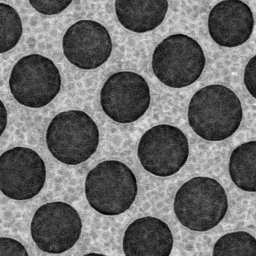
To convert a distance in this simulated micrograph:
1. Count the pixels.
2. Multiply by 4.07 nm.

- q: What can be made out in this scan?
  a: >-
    a regular array of holes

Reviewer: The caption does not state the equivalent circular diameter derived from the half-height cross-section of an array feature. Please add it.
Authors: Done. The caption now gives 53.6 px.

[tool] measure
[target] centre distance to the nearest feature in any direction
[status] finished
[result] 260 nm